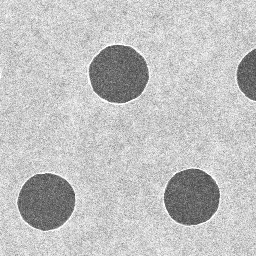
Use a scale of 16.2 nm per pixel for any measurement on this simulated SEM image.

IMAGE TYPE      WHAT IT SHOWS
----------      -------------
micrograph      holes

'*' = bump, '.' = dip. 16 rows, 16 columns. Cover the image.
****************
****************
****************
******...******.
******...******.
******...******.
****************
****************
****************
****************
****************
**..******....**
*....*****....**
*...*******..***
****************
****************